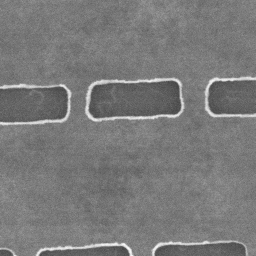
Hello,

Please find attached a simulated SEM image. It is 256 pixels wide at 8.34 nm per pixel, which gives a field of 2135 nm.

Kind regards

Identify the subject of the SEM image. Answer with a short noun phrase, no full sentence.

holes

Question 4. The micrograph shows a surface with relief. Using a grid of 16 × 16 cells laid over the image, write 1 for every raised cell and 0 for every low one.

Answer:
1111111111111111
1111111111111111
1111111111111111
1111111111111111
1111111111111111
0000110000011000
0000110000011000
0000111111111111
1111111111111111
1111111111111111
1111111111111111
1111111111111111
1111111111111111
1111111111111111
1111111111111111
1111110011000001